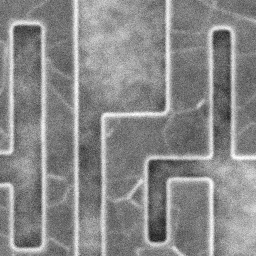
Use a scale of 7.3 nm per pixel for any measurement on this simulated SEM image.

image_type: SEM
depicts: wiring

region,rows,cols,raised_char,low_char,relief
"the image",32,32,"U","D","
UUUUUUUUUUDDDDDDDDDDDUUUUUUUUUUU
UUUUUUUUUUDDDDDDDDDDDUUUUUUUUUUU
UUUUUUUUUUDDDDDDDDDDDUUUUUUUUUUU
UUDDDUUUUUDDDDDDDDDDDUUUUUUUUUUU
UUDDDUUUUUDDDDDDDDDDDUUUUUDDDUUU
UUDDDUUUUUDDDDDDDDDDDUUUUUDDDUUU
UUDDDUUUUUDDDDDDDDDDDUUUUUDDDUUU
UUDDDUUUUUDDDDDDDDDDDUUUUUDDDUUU
UUDDDUUUUUDDDDDDDDDDDUUUUUDDDUUU
UDDDDUUUUUDDDDDDDDDDDUUUUUDDDUUU
UDDDDUUUUUDDDDDDDDDDDUUUUUUDDUUU
UDDDDUUUUUDDDDDDDDDDDUUUUUUDDUUU
UUDDDUUUUUDDDDDDDDDDDUUUUUDDDUUU
UUDDDUUUUUDDDDDDDDDDDUUUUUDDDUUU
UUDDDUUUUUDDDUUUUUUUUUUUUUDDDUUU
UUDDDUUUUUDDDUUUUUUUUUUUUUDDDUUU
UUDDDUUUUUDDDUUUUUUUUUUUUUUDDUUU
UUDDDUUUUUDDDUUUUUUUUUUUUUUDDUUU
UUDDDUUUUUDDDUUUUUUUUUUUUUUDDUUU
DDDDDUUUUUDDDUUUUUUUUUUUUUDDDUUU
DDDDDUUUUUDDDUUUUUUDDDDDDDDDDDDD
DDDDDUUUUUDDDUUUUUDDDDDDDDDDDDDD
DDDDDUUUUUDDDUUUUUDDDUUUUUDDDDDD
UUDDDUUUUUDDDUUUUUDDDUUUUUUDDDDD
UUDDDUUUUUDDDUUUUUDDDUUUUUUDDDDD
UUDDDUUUUUDDDUUUUUDDDUUUUUUDDDDD
UUDDDUUUUUDDDUUUUUDDDUUUUUUDDDDD
UUDDDUUUUUDDDUUUUUDDDUUUUUUDDDDD
UUDDDUUUUUDDDUUUUUDDDUUUUUUDDDDD
UUDDDUUUUUDDDUUUUUUDDUUUUUUDDDDD
UUDDDUUUUUDDDUUUUUUUUUUUUUUDDDDD
UUUUUUUUUUDDDUUUUUUUUUUUUUUDDDDD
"